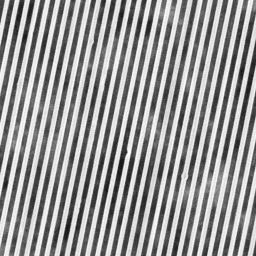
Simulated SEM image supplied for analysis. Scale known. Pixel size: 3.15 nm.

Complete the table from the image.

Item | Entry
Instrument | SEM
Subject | parallel lines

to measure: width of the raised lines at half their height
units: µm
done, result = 0.0146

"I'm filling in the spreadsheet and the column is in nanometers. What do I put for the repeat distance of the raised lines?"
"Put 31.4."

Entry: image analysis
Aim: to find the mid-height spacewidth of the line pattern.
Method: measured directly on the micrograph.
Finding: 17.3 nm